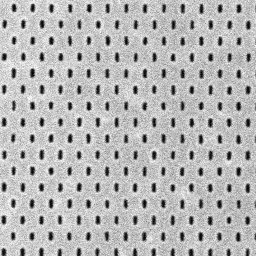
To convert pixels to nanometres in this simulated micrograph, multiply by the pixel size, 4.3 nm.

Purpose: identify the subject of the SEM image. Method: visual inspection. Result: a regular array of holes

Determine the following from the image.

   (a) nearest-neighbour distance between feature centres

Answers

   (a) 79.3 nm